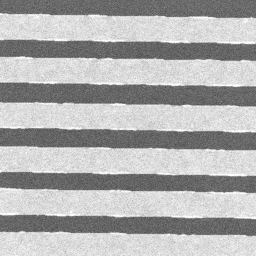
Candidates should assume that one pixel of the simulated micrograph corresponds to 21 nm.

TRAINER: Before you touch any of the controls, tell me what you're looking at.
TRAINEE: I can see lines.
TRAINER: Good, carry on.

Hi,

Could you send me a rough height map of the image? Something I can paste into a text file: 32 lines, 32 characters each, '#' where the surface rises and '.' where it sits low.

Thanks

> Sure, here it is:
................................
................................
################################
################################
################################
................................
................................
#####################...........
################################
################################
......................##########
................................
................................
################################
################################
################################
................................
................................
#####...........................
################################
################################
.......#########################
................................
................................
################################
################################
################################
................................
................................
###############################.
################################
################################